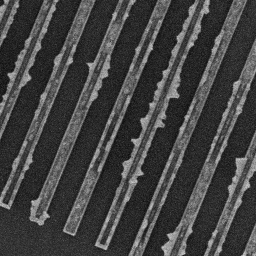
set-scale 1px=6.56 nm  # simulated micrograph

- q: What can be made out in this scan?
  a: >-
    parallel lines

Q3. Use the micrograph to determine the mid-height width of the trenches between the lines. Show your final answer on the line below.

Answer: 148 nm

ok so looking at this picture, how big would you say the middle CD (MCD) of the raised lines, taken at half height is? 82.8 nm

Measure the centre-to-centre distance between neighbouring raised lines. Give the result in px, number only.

35